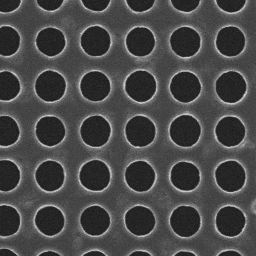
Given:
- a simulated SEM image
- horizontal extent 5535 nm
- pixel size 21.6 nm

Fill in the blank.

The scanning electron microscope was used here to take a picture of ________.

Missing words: a regular array of holes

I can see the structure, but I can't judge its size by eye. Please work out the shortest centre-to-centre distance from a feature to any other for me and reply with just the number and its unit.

965 nm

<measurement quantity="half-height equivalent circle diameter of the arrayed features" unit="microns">0.658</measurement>